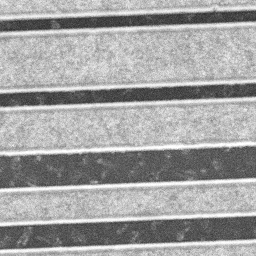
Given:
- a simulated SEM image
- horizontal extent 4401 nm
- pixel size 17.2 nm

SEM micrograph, one or a few lines or trenches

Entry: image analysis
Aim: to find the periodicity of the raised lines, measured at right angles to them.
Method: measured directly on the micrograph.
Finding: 1240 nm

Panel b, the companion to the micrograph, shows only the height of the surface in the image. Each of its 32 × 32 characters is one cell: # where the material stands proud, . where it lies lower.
################################
##################..............
................................
....................############
################################
################################
################################
################################
################################
################################
#######################.........
................................
.............................###
....############################
################################
################################
################################
################################
#################...............
................................
................................
................................
................................
........########################
################################
################################
################################
#############...................
................................
................................
........................########
################################